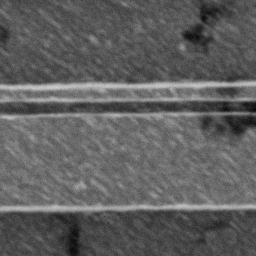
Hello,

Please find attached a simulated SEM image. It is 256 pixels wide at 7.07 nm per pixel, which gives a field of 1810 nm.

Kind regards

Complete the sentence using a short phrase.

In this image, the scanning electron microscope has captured lines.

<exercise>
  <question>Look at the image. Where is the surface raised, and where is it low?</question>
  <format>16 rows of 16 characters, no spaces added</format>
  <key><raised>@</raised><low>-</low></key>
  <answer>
----------------
----------------
----------------
----------------
----------------
@@@@@@@@@@@@@@@@
@@@@@@@@@@@@@@@@
@@@@@@@@@@@@@@@@
@@@@@@@@@@@@@@@@
@@@@@@@@@@@@@@@@
@@@@@@@@@@@@@@@@
@@@@@@@@@@@@@@@@
@@@@@@@@@@@@@@@@
----------------
----------------
----------------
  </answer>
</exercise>